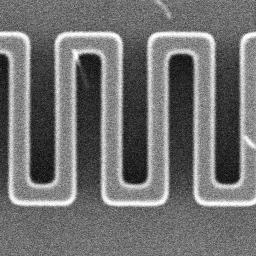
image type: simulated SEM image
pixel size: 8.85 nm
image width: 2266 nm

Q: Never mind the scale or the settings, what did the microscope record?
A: groups of lines, slits or small figures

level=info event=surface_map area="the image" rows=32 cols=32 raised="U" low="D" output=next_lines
DDDDDDDDDDDDDDDDDDDDDDDDDDDDDDDD
DDDDDDDDDDDDDDDDDDDDDDDDDDDDDDDD
DDDDDDDDDDDDDDDDDDDDDDDDDDDDDDDD
DDDDDDDDDDDDDDDDDDDDDDDDDDDDDDDD
UUUDDDDDUUUUUUUDDDDUUUUUUUDDDDDU
UUUUDDDUUUUUUUUDDDDUUUUUUUUDDDUU
UUUUDDDUUUUUUUUDDDDUUUUUUUUDDDUU
DUUUDDDUUUDDDUUDDDDUUDDDUUUDDDUU
DUUUDDDUUDDDDUUDDDDUUDDDUUUDDDUU
DUUUDDDUUDDDDUUDDDDUUDDDUUUDDDUU
DUUUDDDUUDDDDUUDDDDUUDDDUUUDDDUU
DUUUDDDUUDDDDUUDDDDUUDDDUUUDDDUU
DUUUDDDUUDDDDUUDDDDUUDDDUUUDDDUU
DUUUDDDUUDDDDUUDDDDUUDDDUUUDDDUU
DUUUDDDUUDDDDUUDDDDUUDDDUUUDDDUU
DUUUDDDUUDDDDUUDDDDUUDDDUUUDDDUU
DUUUDDDUUDDDDUUDDDDUUDDDUUUDDDUU
DUUUDDDUUDDDDUUDDDDUUDDDUUUDDDUU
DUUUDDDUUDDDDUUDDDDUUDDDUUUDDDUU
DUUUDDDUUDDDDUUDDDDUUDDDUUUDDDUU
DUUUDDDUUDDDDUUDDDDUUDDDUUUDDDUU
DUUUDDDUUDDDDUUDDDDUUDDDUUUDDDUU
DUUUDDDUUDDDDUUDDDUUUDDDUUUDDDUU
DUUUUUUUUDDDDUUUUUUUUDDDUUUUUUUU
DUUUUUUUUDDDDUUUUUUUUDDDUUUUUUUU
DDUUUUUUDDDDDDUUUUUUDDDDDUUUUUUD
DDDDDDDDDDDDDDDDDDDDDDDDDDDDDDDD
DDDDDDDDDDDDDDDDDDDDDDDDDDDDDDDD
DDDDDDDDDDDDDDDDDDDDDDDDDDDDDDDD
DDDDDDDDDDDDDDDDDDDDDDDDDDDDDDDD
DDDDDDDDDDDDDDDDDDDDDDDDDDDDDDDD
DDDDDDDDDDDDDDDDDDDDDDDDDDDDDDDD